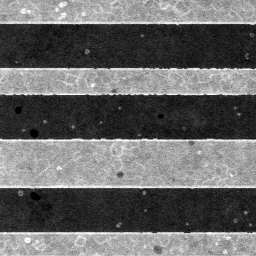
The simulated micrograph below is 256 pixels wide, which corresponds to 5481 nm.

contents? lines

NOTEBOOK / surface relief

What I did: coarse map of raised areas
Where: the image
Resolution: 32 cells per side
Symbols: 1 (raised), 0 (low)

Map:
11111111111111111111111111111111
11111111111111111111111111111111
11111111111111111111111111111111
00000000000000000000000000000000
00000000000000000000000000000000
00000000000000000000000000000000
00000000000000000000000000000000
00000000000000000000000000000000
00000000000000000000000000000000
11111111111111111111111111111111
11111111111111111111111111111111
11111111111111111111111111111111
00000000000000000000000000000000
00000000000000000000000000000000
00000000000000000000000000000000
00000000000000000000000000000000
00000000000000000000000000000000
00000000000000000000000000000000
11111111111111111111111111111111
11111111111111111111111111111111
11111111111111111111111111111111
11111111111111111111111111111111
11111111111111111111111111111111
00100000000000000000000000000000
00000000000000000000000000000000
00000000000000000000000000000000
00000000000000000000000000000000
00000000000000000000000000000000
00000000000000000000000000000000
11111111111111111111111111111111
11111111111111111111111111111111
11111111111111111111111111111111